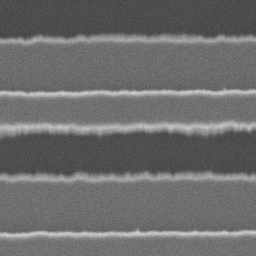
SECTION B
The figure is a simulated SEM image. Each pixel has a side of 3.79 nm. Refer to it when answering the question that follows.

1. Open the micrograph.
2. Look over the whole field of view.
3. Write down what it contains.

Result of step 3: lines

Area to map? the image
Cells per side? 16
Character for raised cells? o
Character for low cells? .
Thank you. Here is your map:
................
................
..o..oooooo.oooo
oooooooooooooooo
oooooooooooooooo
oooooooooooooooo
oooooooooooooooo
oooooooooooooooo
................
................
................
oooooooooooooooo
oooooooooooooooo
oooooooooooooooo
oooooooooooooooo
oooooooooooooooo